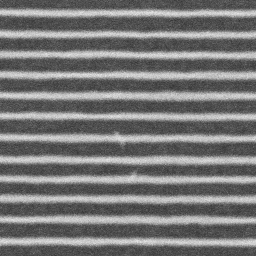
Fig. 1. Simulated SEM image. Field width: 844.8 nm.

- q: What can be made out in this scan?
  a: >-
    parallel lines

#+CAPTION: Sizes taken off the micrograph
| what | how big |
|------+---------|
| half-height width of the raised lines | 19.4 nanometres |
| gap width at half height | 47.4 nm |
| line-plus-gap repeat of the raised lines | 68.6 nm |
